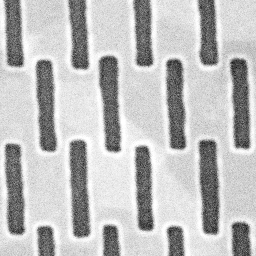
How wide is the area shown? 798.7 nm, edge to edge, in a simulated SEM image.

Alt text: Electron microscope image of a regular array of holes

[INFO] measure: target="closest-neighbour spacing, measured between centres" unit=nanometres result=202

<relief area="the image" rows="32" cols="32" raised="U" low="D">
DDDUUUUUDDDUUUUUDDDUUUUUDDDUUUUU
DDDUUUUUDDDUUUUUUDDUUUUUUDDUUUUU
DDDUUUUUUDDUUUUUUDDUUUUUUDDUUUUU
UDDUUUUUUDDUUUUUUDDUUUUUUDDUUUUU
UDDUUUUUUDDUUUUUUDDUUUUUUDDUUUUU
DDDUUUUUUDDUUUUUUDDUUUUUUDDUUUUU
UDDUUUUUUDDUUUUUUDDUUUUUUDDDUUUU
UDDUUDUUUDDUDDDUUDDUUDDUUDDDUDDU
UDDUDDDUUDDUDDDUUUUUUDDUUUUUUDDU
UUUUDDDUUUUUDDDUUUUUDDDUUUUUUDDU
UUUUDDDUUUUUDDDUUUUUDDDUUUUUUDDU
UUUUDDDUUUUUDDDUUUUUUDDUUUUUUDDU
UUUUDDDUUUUUUDDUUUUUUDDUUUUUUDDU
UUUUUDDUUUUUUDDUUUUUUDDUUUUUUDDU
UUUUUDDUUUUUUDDUUUUUUDDDUUUUUDDD
UUUUUDDUUUUUUDDUUUUUUDDUUUUUUDDD
UUUUUDDUUUUUUDDUUUUUUDDUUUUUUDDD
UUUUUDDUUDDUUDDUUUUUUDDDUDDUUDDD
DDDUUDDUDDDUUDDUUDDUUDDUUDDUUDDU
DDDUUUUUDDDUUUUUUDDUUUUUUDDUUUUU
DDDUUUUUDDDUUUUUUDDUUUUUUDDUUUUU
DDDUUUUUUDDUUUUUUDDUUUUUUDDDUUUU
DDDUUUUUUDDUUUUUUDDUUUUUUDDDUUUU
UDDUUUUUUDDUUUUUUDDUUUUUUDDDUUUU
UDDUUUUUUDDUUUUUUDDUUUUUUDDDUUUU
UDDUUUUUUDDUUUUUUDDUUUUUUDDDUUUU
UDDUUUUUUDDDUUUUUDDUUUUUUDDDUUUU
UDDUUUUUUDDDUUUUUDDUUUUUUDDDUUUU
UDDUDDDUUDDUUDDUUDDUUDDUUDDDUDDU
UUUUDDDUUDDUUDDUUUUUUDDUUUDUUDDU
UUUUDDDUUUUUUDDUUUUUUDDUUUUUUDDD
UUUUUDDUUUUUUDDUUUUUUDDUUUUUUDDD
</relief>